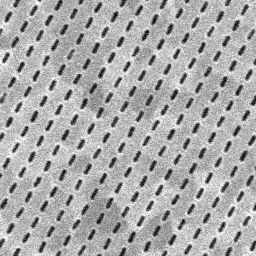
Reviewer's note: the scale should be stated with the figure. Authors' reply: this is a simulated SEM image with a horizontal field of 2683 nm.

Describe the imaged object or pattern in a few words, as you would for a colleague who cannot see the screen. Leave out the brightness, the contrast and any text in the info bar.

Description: a regular array of holes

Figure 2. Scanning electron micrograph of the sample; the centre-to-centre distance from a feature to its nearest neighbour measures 17.8 pixels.